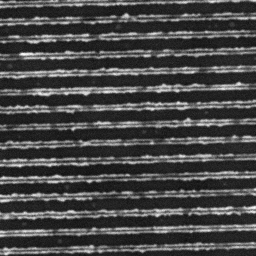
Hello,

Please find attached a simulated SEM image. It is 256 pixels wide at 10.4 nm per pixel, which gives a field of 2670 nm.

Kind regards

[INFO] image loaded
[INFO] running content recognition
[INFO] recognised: parallel lines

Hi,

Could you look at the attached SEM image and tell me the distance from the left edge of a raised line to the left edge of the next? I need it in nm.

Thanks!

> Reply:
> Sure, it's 184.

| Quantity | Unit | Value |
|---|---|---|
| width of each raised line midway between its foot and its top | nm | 50.8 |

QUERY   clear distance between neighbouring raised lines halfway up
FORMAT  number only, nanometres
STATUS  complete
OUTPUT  132